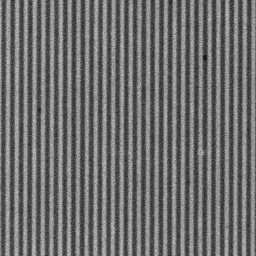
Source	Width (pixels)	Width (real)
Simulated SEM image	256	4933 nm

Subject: parallel lines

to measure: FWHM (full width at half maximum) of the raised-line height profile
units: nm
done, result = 55.4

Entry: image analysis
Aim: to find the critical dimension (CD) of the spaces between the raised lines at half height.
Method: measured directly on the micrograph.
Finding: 111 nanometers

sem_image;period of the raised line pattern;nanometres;169